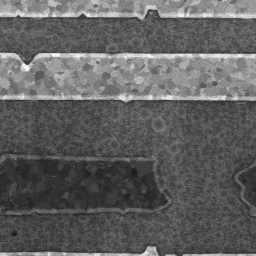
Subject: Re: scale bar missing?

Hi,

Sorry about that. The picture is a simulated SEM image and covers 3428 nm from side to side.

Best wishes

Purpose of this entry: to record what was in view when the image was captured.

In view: one or a few lines or trenches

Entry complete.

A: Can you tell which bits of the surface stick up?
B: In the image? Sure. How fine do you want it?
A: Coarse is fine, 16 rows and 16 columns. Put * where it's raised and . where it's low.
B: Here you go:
****************
................
................
*..*******......
****************
****************
................
................
................
................
**********......
**********.....*
**********.....*
................
................
................